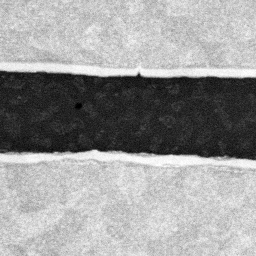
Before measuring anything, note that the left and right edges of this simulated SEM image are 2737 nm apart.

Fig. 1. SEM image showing one or a few lines or trenches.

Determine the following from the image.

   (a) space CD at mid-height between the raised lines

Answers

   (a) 959 nanometers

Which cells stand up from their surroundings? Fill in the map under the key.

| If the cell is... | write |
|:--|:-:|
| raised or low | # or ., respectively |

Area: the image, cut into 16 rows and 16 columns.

################
################
################
################
..........#.#.##
................
................
................
................
................
################
################
################
################
################
################